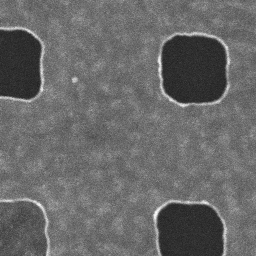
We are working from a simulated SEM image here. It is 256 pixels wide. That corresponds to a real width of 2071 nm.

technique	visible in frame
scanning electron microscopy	holes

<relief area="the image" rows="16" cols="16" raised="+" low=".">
++++++++++++++++
++++++++++++++++
..+++++++++...++
...+++++++....++
...+++++++....++
...+++++++....++
++++++++++++++++
++++++++++++++++
++++++++++++++++
++++++++++++++++
++++++++++++++++
++++++++++++++++
++++++++++++++++
...+++++++....++
..++++++++....++
.+++++++++....++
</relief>